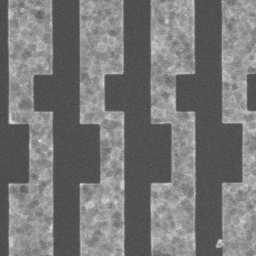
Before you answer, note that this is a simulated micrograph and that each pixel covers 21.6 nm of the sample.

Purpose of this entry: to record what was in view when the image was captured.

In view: wiring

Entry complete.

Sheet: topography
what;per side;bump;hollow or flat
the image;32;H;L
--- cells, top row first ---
LHHHHHLLLLHHHHHLLLLHHHHHLLLLHHHH
LHHHHHLLLLHHHHHLLLLHHHHHLLLLHHHH
LHHHHHLLLLHHHHHLLLLHHHHHLLLLHHHH
LHHHHHLLLLHHHHHLLLLHHHHHLLLLHHHH
LHHHHHLLLLHHHHHLLLLHHHHHLLLLHHHH
LHHHHHLLLLHHHHHLLLLHHHHHLLLLHHHH
LHHHHHLLLLHHHHHLLLLHHHHHLLLLHHHH
LHHHHHLLLLHHHHHLLLLHHHHHLLLLHHHH
LHHHHHLLLLHHHHHLLLLHHHHHLLLLHHHH
LHHHLLLLLLHHHLLLLLLHHHLLLLLLHHHL
LHHHLLLLLLHHHLLLLLLHHHLLLLLLHHHL
LHHHLLLLLLHHHLLLLLLHHHLLLLLLHHHL
LHHHLLLLLLHHHLLLLLLHHHLLLLLLHHHL
LHHHLLLLLLHHHLLLLLLHHHLLLLLLHHHL
LHHHHHLLLLHHHHHLLLLHHHHHLLLLHHHH
LLLHHHLLLLLLHHHLLLLLLHHHLLLLLLHH
LLLLHHLLLLLLLHHLLLLLLLHHLLLLLLHH
LLLLHHLLLLLLLHHLLLLLLLHHLLLLLLHH
LLLLHHHLLLLLLHHLLLLLLLHHLLLLLLHH
LLLLHHHLLLLLLHHLLLLLLLHHLLLLLLHH
LLLLHHHLLLLLLHHLLLLLLLHHLLLLLLHH
LLLLHHLLLLLLLHHLLLLLLLHHLLLLLLHH
LLLLHHLLLLLLLHHLLLLLLHHHLLLLLLHH
LHHHHHLLLLHHHHHLLLLHHHHHLLLLHHHH
LHHHHHHLLLHHHHHLLLLHHHHHLLLLHHHH
LHHHHHHLLLHHHHHLLLLHHHHHLLLLHHHH
LHHHHHHLLLHHHHHLLLLHHHHHLLLLHHHH
LHHHHHHLLLHHHHHLLLLHHHHHLLLLHHHH
LHHHHHLLLLHHHHHLLLLHHHHHLLLLHHHH
LHHHHHHLLLHHHHHLLLLHHHHHLLLLHHHH
LHHHHHHLLLHHHHHLLLLHHHHHLLLHHHHH
LHHHHHHLLLHHHHHLLLLHHHHHLLLLHHHH